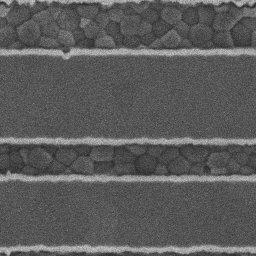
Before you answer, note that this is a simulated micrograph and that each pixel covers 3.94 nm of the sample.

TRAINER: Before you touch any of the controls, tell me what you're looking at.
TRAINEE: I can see one or a few lines or trenches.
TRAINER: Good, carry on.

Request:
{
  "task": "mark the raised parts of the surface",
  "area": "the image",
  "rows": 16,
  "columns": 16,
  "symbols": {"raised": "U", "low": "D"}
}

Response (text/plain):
DDDDDDDDDDDDDDDD
DDDDDDDDDDDDDDDD
DDDDDDDDDDDDDDDD
UUUUUUUUUUUUUUUU
UUUUUUUUUUUUUUUU
UUUUUUUUUUUUUUUU
UUUUUUUUUUUUUUUU
UUUUUUUUUUUUUUUU
UUUUUUUUUUUUUUUU
DDDDDDDDDDDDDDDD
DDDDDDDDDDDDDDDD
UUUUUUUUUUUUUUUU
UUUUUUUUUUUUUUUU
UUUUUUUUUUUUUUUU
UUUUUUUUUUUUUUUU
UUUUUUUUUUUUUUUU